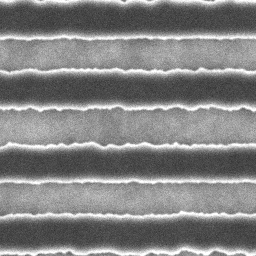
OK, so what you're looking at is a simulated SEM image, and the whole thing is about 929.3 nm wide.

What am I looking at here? lines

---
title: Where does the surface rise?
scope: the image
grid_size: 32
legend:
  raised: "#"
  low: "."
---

################################
################################
################################
################################
################################
................................
................................
................................
................................
################################
################################
################################
################################
##############.######..##..###.#
................................
................................
................................
................................
################################
################################
################################
################################
################################
................................
................................
................................
................................
################################
################################
################################
################################
#######..####.########..##..####